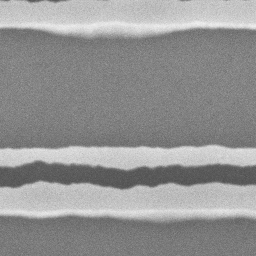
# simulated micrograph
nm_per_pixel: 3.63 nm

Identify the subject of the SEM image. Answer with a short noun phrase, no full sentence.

lines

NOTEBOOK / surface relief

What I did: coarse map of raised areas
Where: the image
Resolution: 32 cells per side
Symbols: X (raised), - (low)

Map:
XXXXXXXXXXXXXXXXXXXXXXXXXXXXXXXX
XXXXXXXXXXXXXXXXXXXXXXXXXXXXXXXX
XXXXXXXXXXXXXXXXXXXXXXXXXXXXXXXX
------XXXXXXXXXXXXXXX-----------
--------------------------------
--------------------------------
--------------------------------
--------------------------------
--------------------------------
--------------------------------
--------------------------------
--------------------------------
--------------------------------
--------------------------------
--------------------------------
--------------------------------
--------------------------------
--------------------------------
--------XXX------XX---XXXXXX----
XXXXXXXXXXXXXXXXXXXXXXXXXXXXXXXX
XXX--------XXXXXXXXXXXXXXXX--XXX
--------------------------------
--------------------------------
--XXXXXXXXXXXX---XXXXXXXXXXXXXXX
XXXXXXXXXXXXXXXXXXXXXXXXXXXXXXXX
XXXXXXXXXXXXXXXXXXXXXXXXXXXXXXXX
XXXXXXXXXXXXXXXXXXXXXXXXXXXXXXXX
--------------------------------
--------------------------------
--------------------------------
--------------------------------
--------------------------------